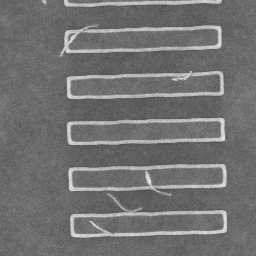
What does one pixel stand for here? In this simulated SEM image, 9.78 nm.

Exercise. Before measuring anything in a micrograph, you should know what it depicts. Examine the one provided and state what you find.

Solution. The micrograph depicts groups of lines, slits or small figures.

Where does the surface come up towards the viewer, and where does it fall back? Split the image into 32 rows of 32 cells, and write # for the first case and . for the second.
.........####...................
................................
................................
.........................##.....
........###################.....
........###################.....
................................
................................
................................
...............#############....
.........###################....
.........###################....
................................
................................
................................
.........###################....
.........###################....
.........##############.........
................................
................................
................................
.........###################....
.........###################....
.........#########.#............
................................
................................
................................
.........###################....
.........###################....
................................
................................
................................